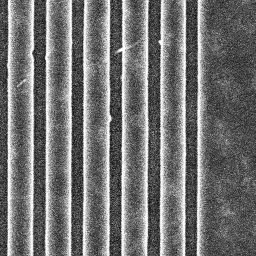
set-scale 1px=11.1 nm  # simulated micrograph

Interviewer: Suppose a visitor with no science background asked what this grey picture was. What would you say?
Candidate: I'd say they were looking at parallel lines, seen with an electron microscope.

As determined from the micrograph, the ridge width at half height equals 269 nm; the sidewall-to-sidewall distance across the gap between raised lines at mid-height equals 150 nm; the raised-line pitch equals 421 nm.